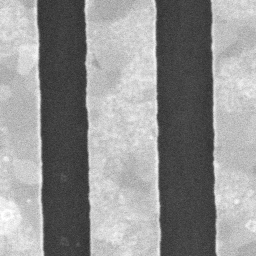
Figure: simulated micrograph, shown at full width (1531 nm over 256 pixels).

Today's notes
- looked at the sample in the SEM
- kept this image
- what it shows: lines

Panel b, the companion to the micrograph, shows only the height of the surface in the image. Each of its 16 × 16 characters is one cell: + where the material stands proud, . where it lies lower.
++...+++++...+++
++...+++++...+++
++...+++++...+++
++...+++++...+++
++...+++++...+++
++...+++++...+++
++...+++++...+++
++....++++...+++
++....++++...+++
+++...++++...+++
+++...++++...+++
+++...++++...+++
+++...++++...+++
+++...++++....++
+++...++++....++
+++...++++....++